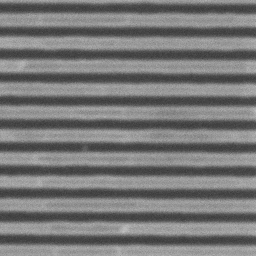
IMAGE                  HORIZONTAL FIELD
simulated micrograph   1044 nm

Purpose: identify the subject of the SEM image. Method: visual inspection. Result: wiring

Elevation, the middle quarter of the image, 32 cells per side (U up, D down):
UUUUUUUUUUUUUUUUUUUUUUUUUUUUUUUU
UUUUUUUUUUUUUUUUUUUUUUUUUUUUUUUU
DDDDDDDDDDDDDDDDDDDDDDDDDDDDDDDD
DDDDDDDDDDDDDDDDDDDDDDDDDDDDDDDD
DDDDDDDDDDDDDDDDDDDDDDDDDDDDDDDD
UUUUUUUUUUUUUUUUUUUUUUUUUUUUUUUU
UUUUUUUUUUUUUUUUUUUUUUUUUUUUUUUU
UUUUUUUUUUUUUUUUUUUUUUUUUUUUUUUU
DDDDDDDDDDDDDDDDDDDDDDDDDDDDDDDD
DDDDDDDDDDDDDDDDDDDDDDDDDDDDDDDD
DDDDDDDDDDDDDDDDDDDDDDDDDDDDDDDD
UUUUUUUUUUUUUUUUUUUUUUUUUUUUUUUU
UUUUUUUUUUUUUUUUUUUUUUUUUUUUUUUU
DDDDUUUUDDDDDUUUUUUUUUUUUUUUUUUU
DDDDDDDDDDDDDDDDDDDDDDDDDDDDDDDD
DDDDDDDDDDDDDDDDDDDDDDDDDDDDDDDD
DDDDDDDDDDDDDDDDDDDDDDDDDDDDDDDD
UUUUUUUUUUUUUUUUUUUUUUUUUUUUUUUU
UUUUUUUUUUUUUUUUUUUUUUUUUUUUUUUU
DDDDDDDDDDDDDDDDDDDDDDDDDDDDDDDD
DDDDDDDDDDDDDDDDDDDDDDDDDDDDDDDD
DDDDDDDDDDDDDDDDDDDDDDDDDDDDDDDD
UUUUUUUUUUUUUUUUUUUUUUUUUUUUUUUU
UUUUUUUUUUUUUUUUUUUUUUUUUUUUUUUU
UUUUUUUUUUUUUUUUUUUUUUUUUUUUUUUU
DDDDDDDDDDDDDDDDDDDDDDDDDDDDDDDD
DDDDDDDDDDDDDDDDDDDDDDDDDDDDDDDD
DDDDDDDDDDDDDDDDDDDDDDDDDDDDDDDD
UUUUUUUUUUUUUUUUUUUUUUUUUUUUUUUU
UUUUUUUUUUUUUUUUUUUUUUUUUUUUUUUU
UUUUUUUUUUUUUUUUUUUUUUUUUUUUUUUU
DDDDDDDDDDDDDDDDDDDDDDDDDDDDDDDD